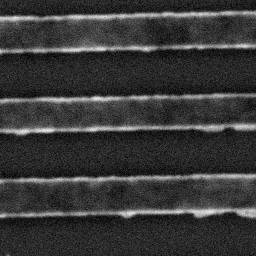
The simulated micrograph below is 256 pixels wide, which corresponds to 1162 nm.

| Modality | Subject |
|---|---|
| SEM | lines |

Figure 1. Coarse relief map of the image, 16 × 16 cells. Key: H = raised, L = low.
LLLLLLLLLLLLLLLL
HHHHHHHHHHHHHHHH
HHHHHHHHHHHHHHHH
LLLLLLLLLLLLLLLL
LLLLLLLLLLLLLLLL
LLLLLLLLLLLLLLLL
HHHHHHHHHHHHHHHH
HHHHHHHHHHHHHHHH
LLLLLLLLLLLLLLLL
LLLLLLLLLLLLLLLL
LLLLLLLLLLLLLLLL
HHHHHHHHHHHHHHHH
HHHHHHHHHHHHHHHH
HLLLLLLLLLLLLLLL
LLLLLLLLLLLLLLLL
LLLLLLLLLLLLLLLL